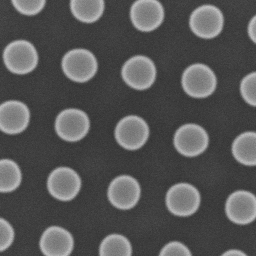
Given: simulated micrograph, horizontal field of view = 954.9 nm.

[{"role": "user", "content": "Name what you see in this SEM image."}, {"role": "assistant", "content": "an array of small figures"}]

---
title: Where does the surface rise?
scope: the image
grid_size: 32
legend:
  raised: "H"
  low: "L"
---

LLHHHHLLLHHHHLLLLHHHLLLLLLLLLLLL
LLHHHLLLLHHHHLLLHHHHLLLLHHHHLLLL
LLLLLLLLLLHHLLLLHHHHLLLLHHHHLLLH
LLLLLLLLLLLLLLLLLHHHLLLLHHHHLLLH
LLLLLLLLLLLLLLLLLLLLLLLLLHHLLLLH
LHHHLLLLLLLLLLLLLLLLLLLLLLLLLLLL
HHHHHLLLLHHLLLLLLLLLLLLLLLLLLLLL
HHHHHLLLHHHHLLLLHHHLLLLLLLLLLLLL
LHHHLLLLHHHHLLLHHHHLLLLHHHLLLLLL
LLLLLLLLHHHHLLLHHHHLLLLHHHHLLLLH
LLLLLLLLLLLLLLLLHHHLLLLHHHHLLLHH
LLLLLLLLLLLLLLLLLLLLLLLHHHHLLLHH
LLLLLLLLLLLLLLLLLLLLLLLLLLLLLLLH
HHHLLLLLLLLLLLLLLLLLLLLLLLLLLLLL
HHHHLLLHHHHLLLLLHLLLLLLLLLLLLLLL
HHHLLLLHHHHLLLLHHHLLLLLLLLLLLLLL
LHHLLLLHHHHLLLHHHHHLLLHHHHLLLLLH
LLLLLLLLHHLLLLLHHHLLLLHHHHLLLHHH
LLLLLLLLLLLLLLLLHLLLLLHHHHLLLHHH
LLLLLLLLLLLLLLLLLLLLLLLHLLLLLHHH
HHLLLLLLLLLLLLLLLLLLLLLLLLLLLLHH
HHHLLLLHHLLLLLLLLLLLLLLLLLLLLLLL
HHHLLLHHHHLLLLHHHLLLLLLLLLLLLLLL
HHLLLLHHHHLLLLHHHLLLLHHHLLLLLLLL
LLLLLLLHHLLLLHHHHLLLLHHHHLLLLHHH
LLLLLLLLLLLLLLHHHLLLLHHHHLLLHHHH
LLLLLLLLLLLLLLLLLLLLLHHHLLLLHHHH
HLLLLLLLLLLLLLLLLLLLLLLLLLLLLHHH
HHLLLLHHLLLLLLLLLLLLLLLLLLLLLLLL
HHLLLHHHHLLLLLHLLLLLLLLLLLLLLLLL
HLLLLHHHHLLLLHHHLLLLLHHLLLLLLLLL
LLLLLHHHHLLLHHHHLLLLHHHHLLLLHHLL